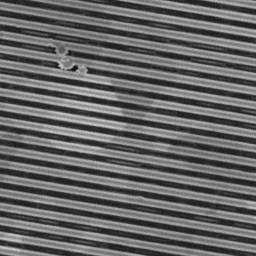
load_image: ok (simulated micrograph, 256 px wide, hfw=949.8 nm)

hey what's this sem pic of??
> parallel lines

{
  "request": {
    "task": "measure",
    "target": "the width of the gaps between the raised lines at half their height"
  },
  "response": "28.3 nm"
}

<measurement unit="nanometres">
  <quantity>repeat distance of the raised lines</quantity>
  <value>52.5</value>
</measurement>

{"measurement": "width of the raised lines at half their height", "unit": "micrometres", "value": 0.0251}